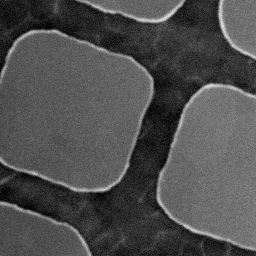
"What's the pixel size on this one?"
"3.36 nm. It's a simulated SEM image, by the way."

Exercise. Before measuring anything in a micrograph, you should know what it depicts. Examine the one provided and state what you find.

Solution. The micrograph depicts raised bodies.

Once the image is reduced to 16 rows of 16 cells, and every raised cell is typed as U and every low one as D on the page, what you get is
DDDDDDUUUUUDDDUU
DDDDDDDDDDDDDDUU
DUUUUDDDDDDDDDUU
DUUUUUUUDDDDDDDD
UUUUUUUUUDDDDDDD
UUUUUUUUUUDDDUUD
UUUUUUUUUDDDUUUU
UUUUUUUUUDDUUUUU
UUUUUUUUUDDUUUUU
UUUUUUUUDDDUUUUU
DUUUUUUUDDUUUUUU
DDDDUUUDDDUUUUUU
DDDDDDDDDDUUUUUU
UUUDDDDDDDDUUUUU
UUUUUDDDDDDDUUUU
UUUUUDDDDDDDDDDU